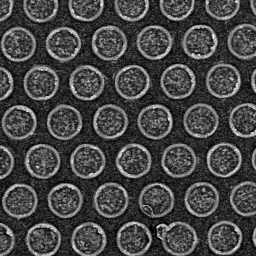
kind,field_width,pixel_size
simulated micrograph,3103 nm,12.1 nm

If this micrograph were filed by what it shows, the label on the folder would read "a regular array of raised bodies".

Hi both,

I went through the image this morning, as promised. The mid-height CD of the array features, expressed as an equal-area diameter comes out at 386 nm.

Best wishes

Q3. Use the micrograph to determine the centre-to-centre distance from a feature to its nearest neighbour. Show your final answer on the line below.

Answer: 0.547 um